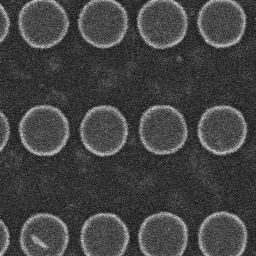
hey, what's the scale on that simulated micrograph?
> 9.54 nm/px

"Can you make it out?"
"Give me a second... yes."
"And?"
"raised bodies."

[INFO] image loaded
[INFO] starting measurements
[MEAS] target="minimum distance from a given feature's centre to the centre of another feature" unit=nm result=563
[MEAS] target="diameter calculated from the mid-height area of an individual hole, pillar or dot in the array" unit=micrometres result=0.452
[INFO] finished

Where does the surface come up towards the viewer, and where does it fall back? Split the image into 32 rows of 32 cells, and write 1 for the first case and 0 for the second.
00011110000111100011110000111100
10011111001111110011111001111100
10111111001111110111111001111110
10011111001111110111111001111110
10011111001111100011111001111100
00001110000011000001110000111000
00000000000000000000000000000000
00000000000000000000000000000000
00000000000000000000000000000000
00000000000000000000000000000000
00000000000000000000000000000000
00000000000000000000000000000000
00000000000000000000000000000000
00001110000011000001100000011000
00011111000111100011111001111100
10011111001111110011111001111110
10011111001111110011111001111110
10011111001111110011111001111100
00011111000111100011110000111100
00000000000000000000000000000000
00000000000000000000000000000000
00000000000000000000000000000000
00000000000000000000000000000000
00000000000000000000000000000000
00000000000000000000000000000000
00000000000000000000000000000000
00000000000000000000000000000000
00001110000111100011110000111100
10011111001111110011111001111110
10011111001111110111111001111110
10011111001111110111111001111110
00011111000111100011111001111100